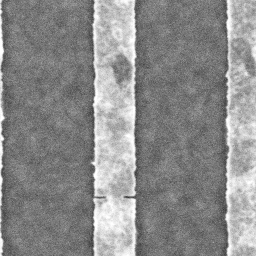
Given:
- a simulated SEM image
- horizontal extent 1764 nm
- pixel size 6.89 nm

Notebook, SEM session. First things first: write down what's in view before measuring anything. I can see one or a few lines or trenches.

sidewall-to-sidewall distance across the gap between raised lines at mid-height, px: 93.7